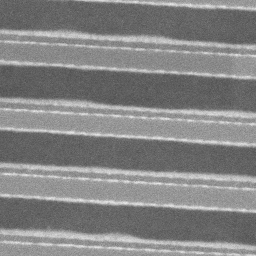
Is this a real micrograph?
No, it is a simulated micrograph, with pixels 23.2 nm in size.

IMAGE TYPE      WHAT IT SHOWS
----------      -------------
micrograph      lines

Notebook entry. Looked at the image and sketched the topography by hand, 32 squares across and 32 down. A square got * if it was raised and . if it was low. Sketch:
....................************
................................
................................
................................
******..........................
***********************.........
********************************
********************************
.............*******************
.............................***
................................
................................
................................
*************...................
******************************..
********************************
.......*************************
......................**********
................................
................................
................................
*************...................
*****************************...
********************************
..******************************
...................*************
................................
................................
................................
******..........................
*********************...........
********************************